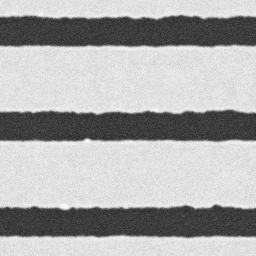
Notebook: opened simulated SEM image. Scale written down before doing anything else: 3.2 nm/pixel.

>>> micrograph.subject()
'lines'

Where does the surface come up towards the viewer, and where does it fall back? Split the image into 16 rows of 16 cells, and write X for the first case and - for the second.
XXXXXXXXXXXXXXXX
----------------
----------------
XXXXXXXXXXXXXXXX
XXXXXXXXXXXXXXXX
XXXXXXXXXXXXXXXX
XXXXXXXXXXXXXXXX
----------------
----------------
XXXXXXXXXXXXXXXX
XXXXXXXXXXXXXXXX
XXXXXXXXXXXXXXXX
XXXXXXXXXXXXXXXX
----------------
----------------
XXXXXXXXXXXXXXXX